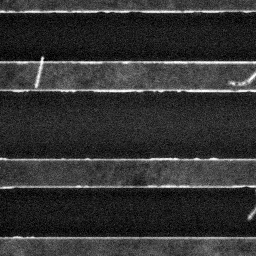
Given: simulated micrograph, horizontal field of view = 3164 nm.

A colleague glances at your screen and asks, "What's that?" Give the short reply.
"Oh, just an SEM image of lines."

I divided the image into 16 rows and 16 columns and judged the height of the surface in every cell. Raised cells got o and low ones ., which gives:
oooooooooooooooo
................
................
................
oooooooooooooooo
oooooooooooooooo
................
................
................
................
oooooooooooooooo
oooooooooooooooo
................
................
................
oooooooooooooooo